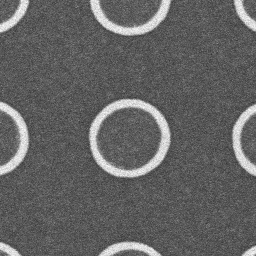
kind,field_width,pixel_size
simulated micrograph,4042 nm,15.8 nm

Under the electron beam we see raised bodies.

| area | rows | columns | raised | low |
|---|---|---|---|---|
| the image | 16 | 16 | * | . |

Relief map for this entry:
*.....****.....*
*......***......
................
................
................
................
........*.......
*.....****.....*
*.....****.....*
*.....****.....*
.......**.......
................
................
................
................
.......**.......